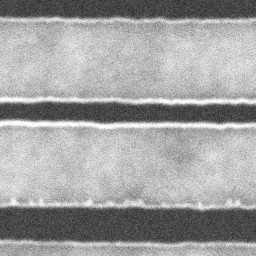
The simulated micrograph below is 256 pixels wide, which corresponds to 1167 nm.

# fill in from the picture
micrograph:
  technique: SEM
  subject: lines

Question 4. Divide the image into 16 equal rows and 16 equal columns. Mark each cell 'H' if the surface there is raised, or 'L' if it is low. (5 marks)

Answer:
HHHHHHHHHHHHHHHH
LLLLLLLLLLLLLLLL
LLLLLLLLLLLLLLLL
LLLLLLLLLLLLLLLL
LLLLLLLLLLLLLLLL
LLLLLLLLLLLLLLLL
HHHHHHHHHHHHHHHH
HHHHHHHHHHHHHHHH
LLLLLLLLLLLLLLLL
LLLLLLLLLLLLLLLL
LLLLLLLLLLLLLLLL
LLLLLLLLLLLLLLLL
LLLLLLLLLLLLLLLL
HHHHHHHHHHHHHHHH
HHHHHHHHHHHHHHHH
LLLLLLLLLLLLLLLL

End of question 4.